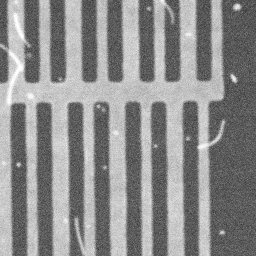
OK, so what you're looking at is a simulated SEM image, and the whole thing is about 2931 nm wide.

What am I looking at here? groups of lines, slits or small figures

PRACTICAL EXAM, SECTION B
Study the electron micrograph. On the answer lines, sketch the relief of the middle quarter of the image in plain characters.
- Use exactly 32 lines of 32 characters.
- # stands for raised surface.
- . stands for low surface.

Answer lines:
.###.....##....####....##....###
.###.....##....####....##....###
.###.....##....####....##....###
.###.....##....####....##....###
#####...####..######..####..####
################################
################################
################################
################################
#...####...#####...###...#####..
#....##....####....###....###...
#....##.....###....##.....###...
#....##.....###.....#.....###...
#....##.....###....###....###...
#....##.....###....##.....###...
#....##.....###....##.....###...
#....##.....###....##.....###...
#....##.....###....###....###...
#....##.....###....###....###...
#....##.....###....###....####..
#....##.....###.....##....####..
#....##.....###.....##....###...
#....##.....###.....##....###...
#....##.....###.....##....####..
#....##.....###.....##....####..
#....##.....###.....##....####..
#....##.....###.....##....###...
#....##.....###.....##....###...
#....##.....###.....##....###...
#....##.....###.....##....####..
#....##.....###.....##....####..
#....##.....###.....##....####..